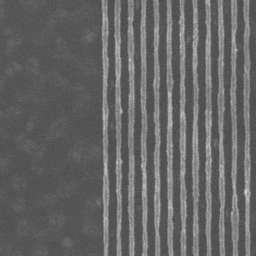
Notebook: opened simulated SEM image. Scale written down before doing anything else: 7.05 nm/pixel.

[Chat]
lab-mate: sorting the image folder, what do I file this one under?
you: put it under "parallel lines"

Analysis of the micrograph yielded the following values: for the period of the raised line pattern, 12.9 px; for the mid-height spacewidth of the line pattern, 8 px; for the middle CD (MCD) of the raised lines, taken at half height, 4.5 pixels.